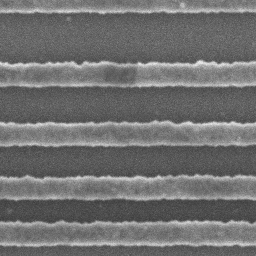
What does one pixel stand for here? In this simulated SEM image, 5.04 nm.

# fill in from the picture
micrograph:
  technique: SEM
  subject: lines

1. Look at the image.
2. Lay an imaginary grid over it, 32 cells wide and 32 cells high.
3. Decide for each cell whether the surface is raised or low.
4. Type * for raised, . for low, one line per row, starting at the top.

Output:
********************************
**********..****.**..*.**.......
................................
................................
................................
................................
................................
................................
********************************
********************************
********************************
................................
................................
................................
................................
**.*****************************
********************************
********************************
................................
................................
................................
................................
********************************
********************************
********************************
................................
................................
................................
********************************
********************************
********************************
................................